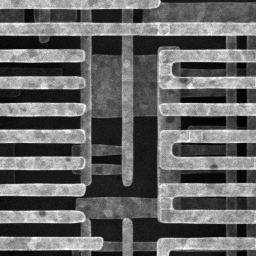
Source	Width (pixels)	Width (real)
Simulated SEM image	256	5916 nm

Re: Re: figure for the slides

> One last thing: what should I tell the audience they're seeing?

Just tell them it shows wiring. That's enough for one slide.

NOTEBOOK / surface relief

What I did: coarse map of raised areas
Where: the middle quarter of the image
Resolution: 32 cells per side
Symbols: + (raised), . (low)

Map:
....+++.......+++......++++++...
....+++.......+++......++++++...
....+++.......+++......++++++...
+++++++.......+++......+++++++++
+++++++........++.......++++++++
+++++++........++.......++++++++
....+++........++.......+++++...
....+++........++.......+++++...
....+++........++.......+++++...
....+++........++.......+++++...
+++++++........++.......++++++++
+++++++........++.......++++++++
+++++++........++.......++++++++
....+++........++.......+++++...
....+++........++.......+++++...
....+++........++.......+++++...
...++++........++.......++++++..
+++++++........++.......++++++++
+++++++........++.......++++++++
+++++++........++.......++++++..
....+++.......+++.......+++++...
....+++.......+++......++++++...
....+++.......+++......++++++...
+++++++.......+++......+++++++++
+++++++.......+++......+++++++++
+++++++........++......+++++++++
....+++........++......+++++++..
....+++........++......++++++...
....+++........++.......+++++...
....+++........++.......+++++...
++++++.........+........++++++++
+++++...................++++++++